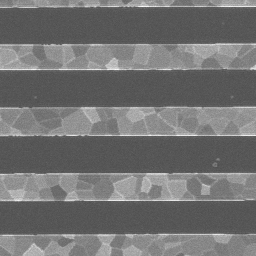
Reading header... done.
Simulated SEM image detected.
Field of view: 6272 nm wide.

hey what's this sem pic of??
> lines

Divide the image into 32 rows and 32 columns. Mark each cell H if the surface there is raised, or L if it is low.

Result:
HHHHHHHHHHHHHHHHHHHHHHHHHHHHHHHH
LLLLLLLLLLLLLLLLLLLLLLLLLLLLLLLL
LLLLLLLLLLLLLLLLLLLLLLLLLLLLLLLL
LLLLLLLLLLLLLLLLLLLLLLLLLLLLLLLL
LLLLLLLLLLLLLLLLLLLLLLLLLLLLLLLL
LLLLLLLLLLLLLLLLLLLLLLLLLLLLLLLL
HHHHHHHHHHHHHHHHHHHHHHHHHHHHHHHH
HHHHHHHHHHHHHHHHHHHHHHHHHHHHHHHH
HHHHHHHHHHHHHHHHHHHHHHHHHHHHHHHH
LLLLLLLLLLLLLLLLLLLLLLLLLLLLLLLL
LLLLLLLLLLLLLLLLLLLLLLLLLLLLLLLL
LLLLLLLLLLLLLLLLLLLLLLLLLLLLLLLL
LLLLLLLLLLLLLLLLLLLLLLLLLLLLLLLL
LLHHHHHHHHHHHHHHHHHHHHHHHHHHHHHH
HHHHHHHHHHHHHHHHHHHHHHHHHHHHHHHH
HHHHHHHHHHHHHHHHHHHHHHHHHHHHHHHH
HHHHHHHHHHHHHHHHHHHHHHHHHHHHHHHH
LLLLLLLLLLLLLLLLLLLLLLLLLLLLLLLL
LLLLLLLLLLLLLLLLLLLLLLLLLLLLLLLL
LLLLLLLLLLLLLLLLLLLLLLLLLLLLLLLL
LLLLLLLLLLLLLLLLLLLLLLLLLLLLLLLL
LLLLLLLLLLLLLLLLLLLLLLLLLLLLLLLL
HHHHHHHHHHHHHHHHHHHHHHHHHHHHHHHH
HHHHHHHHHHHHHHHHHHHHHHHHHHHHHHHH
HHHHHHHHHHHHHHHHHHHHHHHHHHHHHHHH
LLLLLLLLLLLLLLLLLLLLLLLLLLLLLLLL
LLLLLLLLLLLLLLLLLLLLLLLLLLLLLLLL
LLLLLLLLLLLLLLLLLLLLLLLLLLLLLLLL
LLLLLLLLLLLLLLLLLLLLLLLLLLLLLLLL
HHHHHHHHHHHHHHHHHHHHHHHHHHHHHHHH
HHHHHHHHHHHHHHHHHHHHHHHHHHHHHHHH
HHHHHHHHHHHHHHHHHHHHHHHHHHHHHHHH